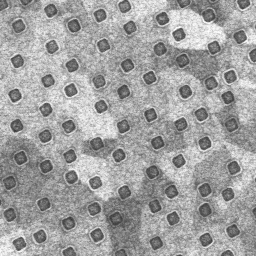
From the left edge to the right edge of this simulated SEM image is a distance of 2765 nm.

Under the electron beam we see a regular array of holes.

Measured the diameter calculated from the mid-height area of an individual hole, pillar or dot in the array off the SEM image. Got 145 nm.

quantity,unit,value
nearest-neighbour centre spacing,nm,279